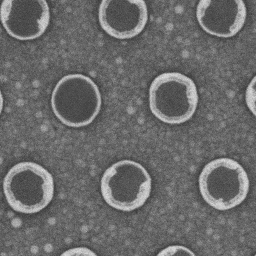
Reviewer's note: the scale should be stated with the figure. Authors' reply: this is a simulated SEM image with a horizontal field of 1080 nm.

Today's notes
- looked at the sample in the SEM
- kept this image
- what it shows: raised bodies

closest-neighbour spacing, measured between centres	0.412	micrometres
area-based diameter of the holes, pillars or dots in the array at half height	205	nm